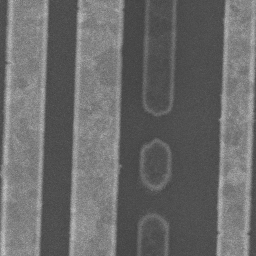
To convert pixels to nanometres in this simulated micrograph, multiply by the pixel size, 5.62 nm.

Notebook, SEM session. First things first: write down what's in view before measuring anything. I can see one or a few lines or trenches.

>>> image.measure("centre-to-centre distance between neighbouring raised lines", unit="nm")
397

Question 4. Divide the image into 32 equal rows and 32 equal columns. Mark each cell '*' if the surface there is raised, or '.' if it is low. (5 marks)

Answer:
.*****....*****...****......****
.*****....*****...****......****
.*****....*****...****......****
.*****....*****...****......****
.*****....*****...****......****
.*****....*****...****......****
.*****....*****...****......****
.****.....*****...****......***.
.****.....*****...****......***.
.****.....*****...***.......***.
.****.....*****...***.......***.
.****.....*****...***.......***.
.****.....*****...***.......***.
.****.....*****...***.......***.
.****.....*****.............***.
.****.....*****.............***.
.****.....*****.............***.
.****....******.............***.
.****....*****....***.......***.
.****....******...***.......***.
.****....*****....***.......***.
.****....*****....***.......***.
.****....*****....***.......***.
.****....*****..............***.
.****....*****..............***.
.****....*****..............***.
.****....*****..............***.
.****....*****....**.......****.
*****....*****....***.......***.
*****....*****...****.......***.
*****....*****...****......****.
*****....*****...****......****.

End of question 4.